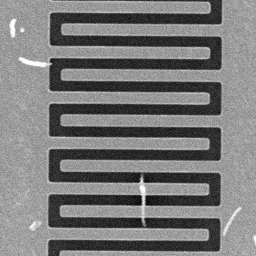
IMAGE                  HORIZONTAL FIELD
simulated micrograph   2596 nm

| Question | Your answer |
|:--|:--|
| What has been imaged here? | groups of lines, slits or small figures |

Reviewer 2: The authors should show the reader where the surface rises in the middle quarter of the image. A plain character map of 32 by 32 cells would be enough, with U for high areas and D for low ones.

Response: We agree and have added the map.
DDDDDDDDDDDDDDDDDDDDDDDDDDDDDDDD
UUUUUUUUUUUUUUUUUUUUUUUUUUUUUUDD
UUUUUUUUUUUUUUUUUUUUUUUUUUUUUUUU
UUUUUUUUUUUUUUUUUUUUUUUUUUUUUUUU
DDDDDDDDDDDDDDDDDDDDDDDDDDDDDDDD
DDDDDDDDDDDDDDDDDDDDDDDDDDDDDDDD
DDDDDDDDDDDDDDDDDDDDDDDDDDDDDDDD
UUUUUUUUUUUUUUUUUUUUUUUUUUUUUUUU
UUUUUUUUUUUUUUUUUUUUUUUUUUUUUUUU
UUUUUUUUUUUUUUUUUUUUUUUUUUUUUUUU
DDDDDDDDDDDDDDDDDDDDDDDDDDDDDDDD
DDDDDDDDDDDDDDDDDDDDDDDDDDDDDDDD
DDDDDDDDDDDDDDDDDDDDDDDDDDDDDDDD
UUUUUUUUUUUUUUUUUUUUUUUUUUUUUUUU
UUUUUUUUUUUUUUUUUUUUUUUUUUUUUUUU
DDDDDUUUUUUUUUUUUUUUUUUUUUUUUUUU
DDDDDDDDDDDDDDDDDDDDDDDDDDDDDDDD
DDDDDDDDDDDDDDDDDDDDDDDDDDDDDDDD
UUUUUUUDDDDDDDDDDDDDDDDDDDDDDDDD
UUUUUUUUUUUUUUUUUUUUUUUUUUUUUUUU
UUUUUUUUUUUUUUUUUUUUUUUUUUUUUUUU
DDDDDDDDDDDDDDDDDDDDDDDDDDDDDDDD
DDDDDDDDDDDDDDDDDDDDDDDDDDDDDDDD
DDDDDDDDDDDDDDDDDDDDDDDDDDDDDDDD
UUUUUUUUUUUUUUUUUUUUUUUUUUUUUUUU
UUUUUUUUUUUUUUUUUUUUUUUUUUUUUUUU
UUUUUUUUUUUUUUUUUUUUUUUUUUUUUUUU
DDDDDDDDDDDDDDDDDDDDDDDDDDDDDDDD
DDDDDDDDDDDDDDDDDDDDDDDDDDDDDDDD
DDDDDDDDDDDDDDDDDDDUDDDDDDDDDDDD
UUUUUUUUUUUUUUUUUUUUUUUUUUUUUUUU
UUUUUUUUUUUUUUUUUUUUUUUUUUUUUUUU